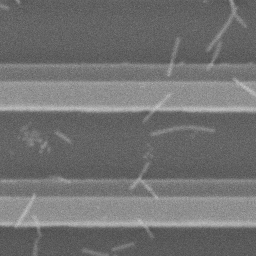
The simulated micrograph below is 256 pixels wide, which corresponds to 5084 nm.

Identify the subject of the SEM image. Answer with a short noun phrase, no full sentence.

lines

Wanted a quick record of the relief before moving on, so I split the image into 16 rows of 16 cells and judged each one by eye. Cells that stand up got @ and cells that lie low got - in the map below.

----------------
----------------
----------------
----------------
@@@@@@@@@@@@@@@@
@@@@@@@@@@@@@@@@
@@@@@@@@@@@@@@@@
----------------
----------------
----------------
----------------
@@@@@@@@@@@@@@@@
@@@@@@@@@@@@@@@@
@@@@@@@@@@@@@@@@
----------------
----------------